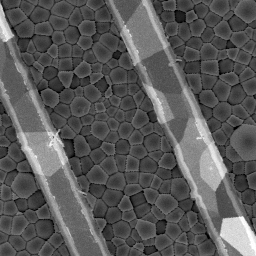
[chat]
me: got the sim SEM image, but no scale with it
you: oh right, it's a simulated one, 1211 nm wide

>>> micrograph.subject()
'one or a few lines or trenches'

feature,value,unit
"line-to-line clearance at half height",518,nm